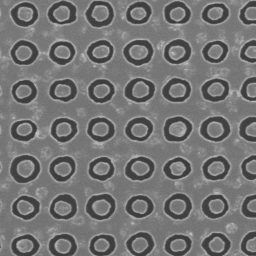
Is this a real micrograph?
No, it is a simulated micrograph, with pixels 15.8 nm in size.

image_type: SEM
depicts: a regular array of ring-shaped grooves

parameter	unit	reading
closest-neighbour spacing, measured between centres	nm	588